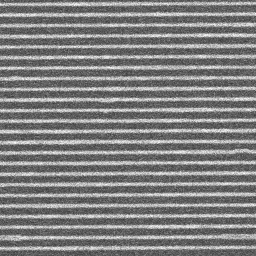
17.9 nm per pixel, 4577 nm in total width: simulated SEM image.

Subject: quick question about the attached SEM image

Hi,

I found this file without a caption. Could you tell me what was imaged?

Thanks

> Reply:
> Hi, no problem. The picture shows parallel lines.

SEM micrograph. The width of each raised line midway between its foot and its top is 49.2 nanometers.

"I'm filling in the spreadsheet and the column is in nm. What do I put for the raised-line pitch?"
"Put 190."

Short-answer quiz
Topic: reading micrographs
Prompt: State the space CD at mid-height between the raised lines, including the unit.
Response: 148 nm